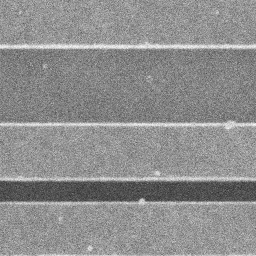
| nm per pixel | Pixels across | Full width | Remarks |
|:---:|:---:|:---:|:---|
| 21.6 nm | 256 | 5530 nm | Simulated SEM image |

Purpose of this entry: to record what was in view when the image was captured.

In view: lines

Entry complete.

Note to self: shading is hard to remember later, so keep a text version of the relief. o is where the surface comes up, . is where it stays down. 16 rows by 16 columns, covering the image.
oooooooooooooooo
oooooooooooooooo
oooooooooooooooo
................
................
................
................
................
oooooooooooooooo
oooooooooooooooo
oooooooooooooooo
................
................
oooooooooooooooo
oooooooooooooooo
oooooooooooooooo